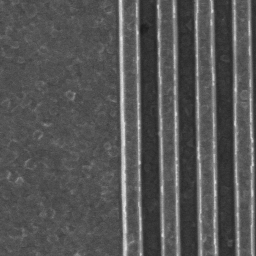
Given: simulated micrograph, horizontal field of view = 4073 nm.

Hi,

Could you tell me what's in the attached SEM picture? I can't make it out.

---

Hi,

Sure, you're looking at parallel lines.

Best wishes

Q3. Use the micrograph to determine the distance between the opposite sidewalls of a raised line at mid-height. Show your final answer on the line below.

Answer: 272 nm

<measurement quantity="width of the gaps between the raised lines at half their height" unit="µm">0.318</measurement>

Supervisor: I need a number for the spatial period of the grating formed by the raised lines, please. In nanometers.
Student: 597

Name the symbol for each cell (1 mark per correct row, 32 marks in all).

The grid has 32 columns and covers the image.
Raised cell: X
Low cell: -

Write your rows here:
---------------XX---XX---X---XX-
---------------XX---XX---XX--XX-
---------------XX---XX--XX---XX-
---------------XX---XX--XXX--XX-
---------------XX---XX--XXX--XX-
---------------XX---XX---XX--XX-
---------------XX---XX---XX--XX-
---------------XX---XX---XX--XX-
---------------XX---XX---XX--XX-
---------------XX---XX---XX--XX-
---------------XX---XX---XX--XX-
---------------XX---XX---XX--XX-
---------------XX---XX---XX--XX-
---------------XX---XX---XX--XX-
---------------XX---XX---XX--XX-
---------------XX---XX---XX--XX-
---------------XX---XX---XX--XX-
---------------XX---XX---XX--XXX
---------------XX---XX---XX--XXX
---------------XX---XX---XX--XXX
---------------XX---XX---XX--XXX
---------------XX---XX---XX--XXX
---------------XX---XX---XX--XXX
---------------XX---XX---XX--XXX
---------------XX---XX---XX--XXX
---------------XX---XX---XX--XXX
---------------XX---XX---XX---XX
----------------XX--XX---XX---XX
----------------XX--XX---XX---XX
----------------XX--XX---XX---XX
----------------XX--XX---XX---XX
----------------XX--XX---XX---XX